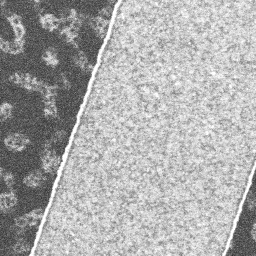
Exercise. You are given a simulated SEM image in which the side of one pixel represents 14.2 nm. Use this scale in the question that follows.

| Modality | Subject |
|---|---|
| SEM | one or a few lines or trenches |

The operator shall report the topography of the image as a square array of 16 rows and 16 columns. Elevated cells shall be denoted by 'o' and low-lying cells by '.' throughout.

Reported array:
ooooooo.........
ooooooo.........
ooooooo.........
oooooo..........
oooooo..........
oooooo..........
ooooo...........
ooooo...........
ooooo...........
oooo............
oooo............
oooo............
ooo............o
ooo............o
oo.............o
oo............oo